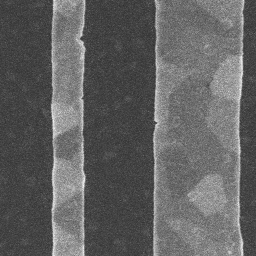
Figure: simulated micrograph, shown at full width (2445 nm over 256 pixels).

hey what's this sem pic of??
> one or a few lines or trenches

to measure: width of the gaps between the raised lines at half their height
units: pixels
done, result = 71.5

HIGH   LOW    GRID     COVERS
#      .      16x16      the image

...##.....#####.
...##.....#####.
...##.....#####.
...##.....####..
...##.....#####.
...##.....##..#.
...##.....#####.
...##.....#####.
...##.....#####.
...##.....#####.
...##.....#####.
...##.....#####.
...##.....#####.
...##.....#####.
...##.....#####.
...##.....#####.